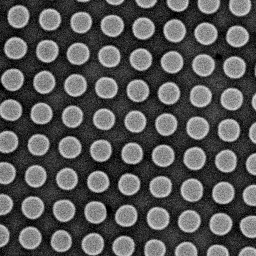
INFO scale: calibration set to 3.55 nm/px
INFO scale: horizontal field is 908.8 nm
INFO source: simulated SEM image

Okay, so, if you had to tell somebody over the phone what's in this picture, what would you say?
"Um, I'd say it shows an array of small figures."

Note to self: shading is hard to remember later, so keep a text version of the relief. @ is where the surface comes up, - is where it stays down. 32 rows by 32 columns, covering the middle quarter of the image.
-----------@@----@@@@----@@@@@--
-------------------@-----@@@@---
--------------------------------
-@@@@-----@---------------------
@@@@@---@@@@@----@@@------------
@@@@@@--@@@@@---@@@@@---@@@@----
-@@@@---@@@@@---@@@@@---@@@@@---
-@@@----@@@@@---@@@@@---@@@@@---
-----------------@@@----@@@@@---
-------------------------@@@----
--------------------------------
@@@@-----@@---------------------
@@@@@---@@@@----@@@-------------
@@@@---@@@@@@---@@@@----@@@@----
@@@@----@@@@---@@@@@---@@@@@---@
-@@-----@@@@----@@@@---@@@@@---@
----------------@@@----@@@@@---@
------------------------@@@----@
@@@-----------------------------
@@@@----@@@---------------------
@@@@---@@@@@---@@@@-----@@------
@@@@---@@@@@---@@@@----@@@@----@
@@@@---@@@@@---@@@@@--@@@@@---@@
-------@@@@----@@@@---@@@@@---@@
----------------@@@----@@@@---@@
------------------------@@-----@
@@------------------------------
@@@----@@@----------------------
@@@---@@@@@---@@@@-----@@-------
@@@---@@@@@---@@@@@---@@@@@---@@
@@@---@@@@@---@@@@@---@@@@@--@@@
-------@@@----@@@@@---@@@@@--@@@